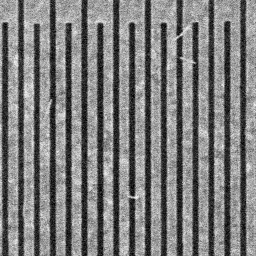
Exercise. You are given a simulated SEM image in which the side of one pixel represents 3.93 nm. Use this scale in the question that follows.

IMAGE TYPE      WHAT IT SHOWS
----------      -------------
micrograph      parallel lines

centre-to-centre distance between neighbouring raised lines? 62.2 nm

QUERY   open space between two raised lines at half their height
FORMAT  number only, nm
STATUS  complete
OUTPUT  27.5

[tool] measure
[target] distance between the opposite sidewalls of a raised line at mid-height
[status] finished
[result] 34.8 nm